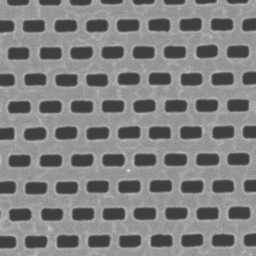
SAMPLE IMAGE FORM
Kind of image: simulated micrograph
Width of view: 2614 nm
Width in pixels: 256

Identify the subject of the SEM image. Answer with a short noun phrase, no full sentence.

a regular array of holes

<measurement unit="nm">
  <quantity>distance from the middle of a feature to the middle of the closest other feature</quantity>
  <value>312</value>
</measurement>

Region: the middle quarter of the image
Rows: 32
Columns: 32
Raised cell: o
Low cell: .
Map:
oooooooooooooooooooooooooooooooo
oooooooooooooooooooooooooooooooo
...ooo....oooo....ooo......oo...
....o......oo......oo......oo...
....oo.....oo......oo......oo...
...ooo.....ooooooooooooooooooo.o
oooooooooooooooooooooooooooooooo
oooooooooooooooooooooooooooooooo
oooooooooooooooooooooooooooooooo
oo.....ooo.....ooo.....oo......o
oo.....oo......oo......oo......o
oo.....ooo.....ooo.....oo......o
oooooooooooooooooooooooooooooooo
oooooooooooooooooooooooooooooooo
oooooooooooooooooooooooooooooooo
oooooooooooooooo..oooooo..oooooo
...ooo.....oo......oo......oo...
...ooo.....oo......oo......oo...
...ooo.....ooo.....oo......oo...
oooooooooooooooooooooooooooooooo
oooooooooooooooooooooooooooooooo
oooooooooooooooooooooooooooooooo
ooo....ooo....ooooo...ooo.....oo
oo.....ooo.....oo......oo......o
oo.....ooo.....oo......oo......o
oo.....ooo.....ooo....oooo...ooo
oooooooooooooooooooooooooooooooo
oooooooooooooooooooooooooooooooo
oooooooooooooooooooooooooooooooo
...ooo.....ooo.....ooo.....ooo..
....o......ooo.....oo......oo...
...ooo.....ooo.....oo......oo...